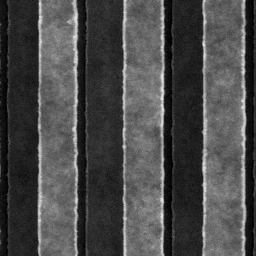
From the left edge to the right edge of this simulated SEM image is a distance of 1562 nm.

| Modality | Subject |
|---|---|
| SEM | lines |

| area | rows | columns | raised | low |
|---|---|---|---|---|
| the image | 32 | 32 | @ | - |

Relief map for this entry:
-----@@@@@------@@@@-----@@@@@@-
-----@@@@@------@@@@@----@@@@@@-
-----@@@@@-----@@@@@@----@@@@@@-
-----@@@@@-----@@@@@@----@@@@@@-
-----@@@@@-----@@@@@@----@@@@@@-
-----@@@@@-----@@@@@@----@@@@@@-
-----@@@@@-----@@@@@@----@@@@@@-
-----@@@@@------@@@@@----@@@@@@-
-----@@@@@-----@@@@@@----@@@@@@-
-----@@@@@-----@@@@@-----@@@@@@-
-----@@@@@-----@@@@@-----@@@@@@-
-----@@@@@-----@@@@@@----@@@@@@-
-----@@@@@-----@@@@@-----@@@@@@-
-----@@@@@-----@@@@@@----@@@@@@-
-----@@@@@-----@@@@@-----@@@@@@-
-----@@@@@------@@@@-----@@@@@@-
-----@@@@@-----@@@@@-----@@@@@@-
-----@@@@@-----@@@@@-----@@@@@@-
-----@@@@@-----@@@@@-----@@@@@@-
-----@@@@@------@@@@-----@@@@@@-
-----@@@@@-----@@@@@-----@@@@@@-
-----@@@@@-----@@@@@@----@@@@@@-
-----@@@@@-----@@@@@@----@@@@@@-
-----@@@@@------@@@@-----@@@@@@-
-----@@@@@-----@@@@@-----@@@@@@-
-----@@@@@-----@@@@@-----@@@@@@-
-----@@@@@------@@@@-----@@@@@@-
-----@@@@@------@@@@-----@@@@@@-
-----@@@@@-----@@@@@-----@@@@@@-
-----@@@@@------@@@@-----@@@@@@-
-----@@@@@------@@@@-----@@@@@@-
-----@@@@@------@@@@-----@@@@@@-